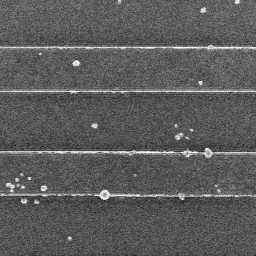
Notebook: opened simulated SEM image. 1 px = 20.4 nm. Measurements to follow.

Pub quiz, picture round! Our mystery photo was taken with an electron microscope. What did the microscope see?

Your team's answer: lines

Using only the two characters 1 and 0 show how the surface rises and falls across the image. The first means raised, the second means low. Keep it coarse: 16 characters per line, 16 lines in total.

0000000000000000
0000000000000000
0000000000000000
1111111111111111
1111111111111111
1111111111111111
0000000000000000
0000000000000000
0000000000000000
0000000010000000
1111111111111111
1111111111111111
0000000000000000
0000000000000000
0000000000000000
0000000000000000